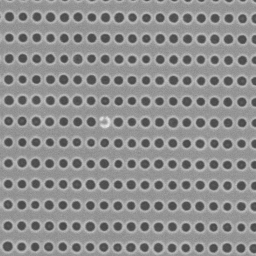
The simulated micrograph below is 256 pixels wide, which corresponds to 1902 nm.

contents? a regular array of holes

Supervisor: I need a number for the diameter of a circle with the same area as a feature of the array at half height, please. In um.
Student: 0.0686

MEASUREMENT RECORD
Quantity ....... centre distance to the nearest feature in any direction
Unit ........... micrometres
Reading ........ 0.101